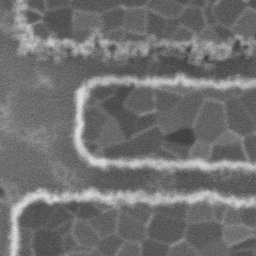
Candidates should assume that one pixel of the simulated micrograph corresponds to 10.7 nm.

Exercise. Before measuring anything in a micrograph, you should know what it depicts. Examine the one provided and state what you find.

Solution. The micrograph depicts one or a few lines or trenches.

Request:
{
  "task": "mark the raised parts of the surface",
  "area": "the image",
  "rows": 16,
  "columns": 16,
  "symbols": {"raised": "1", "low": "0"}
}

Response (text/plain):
0111111111111111
0111111111111111
0011111111111111
0000000000001100
0000000000000000
0000011111111111
0000011111111111
0000011111111111
0000011111111111
0000011111111111
0000000000000000
0000000000000000
0011111111111100
0111111111111111
0111111111111111
0111111111111111